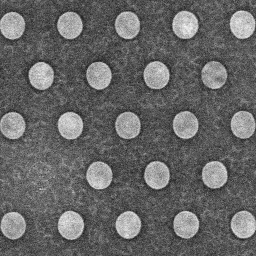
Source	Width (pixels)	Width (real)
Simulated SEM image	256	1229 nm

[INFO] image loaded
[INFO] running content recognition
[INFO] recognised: a regular array of raised bodies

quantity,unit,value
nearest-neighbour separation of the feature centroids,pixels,57.5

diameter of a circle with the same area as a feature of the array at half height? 26.4 px